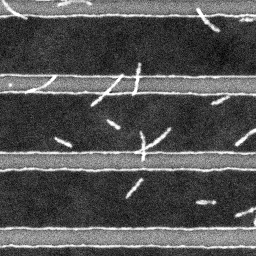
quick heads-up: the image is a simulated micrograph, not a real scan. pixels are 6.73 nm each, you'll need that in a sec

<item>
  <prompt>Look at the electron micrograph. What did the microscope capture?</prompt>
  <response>lines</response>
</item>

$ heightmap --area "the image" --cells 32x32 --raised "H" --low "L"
LLLLLLLLLLLLLLLLLLLLLLLLLLLLLLLL
LLLLLLLLLLLLLLLLLLLLLLLLLLLLLLLL
HHHHHHHHHHHHHHHHHHHHHHHHHHHHHHHH
HHHHHHHHHHHHHHHHHHHHHHHHHHHHHHHH
HHHHHHHHHHHHHHHHHHHHHHHHHHHHHHHH
HHHHHHHHHHHHHHHHHHHHHHHHHHHHHHHH
HHHHHHHHHHHHHHHHHHHHHHHHHHHHHHHH
HHHHHHHHHHHHHHHHHHHHHHHHHHHHHHHH
HHHHHHHHHHHHHHHHHHHHHHHHHHHHHHHH
LLLLLLHLLHHHHHHHHHHHHHHHHHHHHHHH
LLLLLLLLLLLLLLLLLLLLLLLLLLLLLLLL
HHHHHHHLLLHLLLLLHLLLLLLLLLLLLLLL
HHHHHHHHHHHHHHHHHHHHHHHHHHHHHHHH
HHHHHHHHHHHHHHHHHHHHHHHHHHHHHHHH
HHHHHHHHHHHHHHHHHHHHHHHHHHHHHHHH
HHHHHHHHHHHHHHHHHHHHHHHHHHHHHHHH
HHHHHHHHHHHHHHHHHHHHHHHHHHHHHHHH
HHHHHHHHHHHHHHHHHHHHHHHHHHHHHHHH
HHHHHHHHHHHHHHHHHHHHHHHHHHHHHHHH
LLLLLLLLLLLLLLLLLLLLLLLLLLLLLLLL
LLLLLLLLLLLLLLLLLLLLLLLLLLLLLLLL
HHHHHHHHHHHHHHHHHHHHHHHHHHHHHHHH
HHHHHHHHHHHHHHHHHHHHHHHHHHHHHHHH
HHHHHHHHHHHHHHHHHHHHHHHHHHHHHHHH
HHHHHHHHHHHHHHHHHHHHHHHHHHHHHHHH
HHHHHHHHHHHHHHHHHHHHHHHHHHHHHHHH
HHHHHHHHHHHHHHHHHHHHHHHHHHHHHHHH
HHHHHHHHHHHHHHHHHHHHHHHHHHHHHHHH
HHLHHHHHHHHHHHHHHHHHHHHHHHHHHHHH
LLLLLLLLLLLLLLLLLLLLLLLLLLLLLLLL
LLLLLLLLLLLLLLLLLLLLLLLLLLLLLLLL
HHHHHHHHHHHHHHHHHHHHHHHHHHHHHHHH